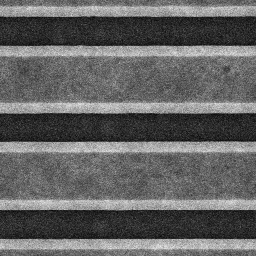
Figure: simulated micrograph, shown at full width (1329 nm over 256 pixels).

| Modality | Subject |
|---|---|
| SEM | one or a few lines or trenches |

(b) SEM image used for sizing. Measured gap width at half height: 190 nm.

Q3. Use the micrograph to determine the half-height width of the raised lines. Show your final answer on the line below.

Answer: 313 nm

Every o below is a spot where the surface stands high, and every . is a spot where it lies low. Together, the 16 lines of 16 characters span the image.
oooooooooooooooo
................
................
oooooooooooooooo
oooooooooooooooo
oooooooooooooooo
oooooooooooooooo
................
................
oooooooooooooooo
oooooooooooooooo
oooooooooooooooo
oooooooooooooooo
................
................
oooooooooooooooo